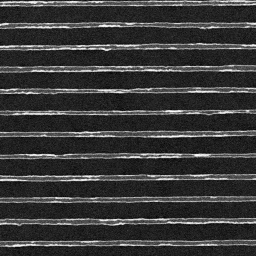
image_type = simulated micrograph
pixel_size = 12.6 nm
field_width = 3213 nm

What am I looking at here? parallel lines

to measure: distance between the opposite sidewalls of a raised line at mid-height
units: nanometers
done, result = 54.9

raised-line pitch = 274 nm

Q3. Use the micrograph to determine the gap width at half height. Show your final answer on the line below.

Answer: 220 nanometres